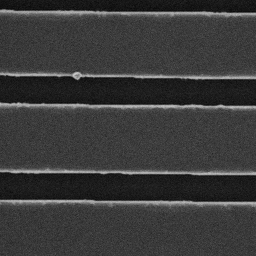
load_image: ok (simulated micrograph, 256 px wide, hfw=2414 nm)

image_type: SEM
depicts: lines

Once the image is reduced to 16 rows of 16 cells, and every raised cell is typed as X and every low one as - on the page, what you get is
----------------
XXXXXXXXXXXXXXXX
XXXXXXXXXXXXXXXX
XXXXXXXXXXXXXXXX
XXXXXXXXXXXXXXXX
----------------
----------------
XXXXXXXXXXXXXXXX
XXXXXXXXXXXXXXXX
XXXXXXXXXXXXXXXX
XXXXXXXXXXXXXXXX
----------------
----------------
XXXXXXXXXXXXXXXX
XXXXXXXXXXXXXXXX
XXXXXXXXXXXXXXXX